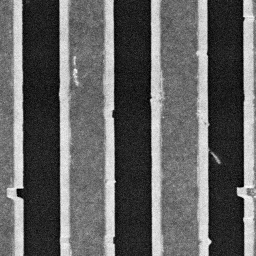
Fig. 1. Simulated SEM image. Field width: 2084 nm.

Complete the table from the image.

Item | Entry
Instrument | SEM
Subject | one or a few lines or trenches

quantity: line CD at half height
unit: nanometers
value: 393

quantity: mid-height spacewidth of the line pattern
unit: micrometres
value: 0.36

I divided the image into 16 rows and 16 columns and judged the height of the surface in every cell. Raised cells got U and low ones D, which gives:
UDDDUUUDDDUUUDDU
UDDDUUUDDDUUUDDU
UDDDUUUDDDUUUDDU
UDDDUUUDDDUUUDDU
UDDDUUUDDDUUUDDU
UDDDUUUDDDUUUDDU
UDDDUUUDDDUUUDDD
UDDDUUUDDDUUUDDD
UDDDUUUDDDUUUDDD
UDDDUUUDDDUUUDDD
UDDDUUUDDDUUUDDD
UDDDUUUDDDUUUDDU
UDDDUUUDDDUUUDDU
UDDDUUUDDDUUUDDU
UDDDUUUDDDUUUDDD
UDDDUUUDDDUUUDDD